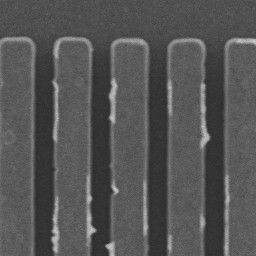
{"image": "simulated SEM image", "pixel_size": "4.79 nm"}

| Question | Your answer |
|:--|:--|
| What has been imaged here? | parallel lines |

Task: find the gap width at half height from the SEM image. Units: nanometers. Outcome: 97.1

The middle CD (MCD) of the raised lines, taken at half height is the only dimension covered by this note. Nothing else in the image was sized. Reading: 176 nanometres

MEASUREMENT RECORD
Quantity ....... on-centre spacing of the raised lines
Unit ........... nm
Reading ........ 273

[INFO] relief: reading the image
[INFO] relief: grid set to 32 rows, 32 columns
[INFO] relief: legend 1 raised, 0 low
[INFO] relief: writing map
00000000000000000000000000000000
00000000000000000000000000000000
00000000000000000000000000000000
00000000000000000000000000000000
00000000000000000000000000000000
11110001111000111100011110001111
11110001111100111100011111001111
11110001111000111100011111001111
11110001111000111100011110001111
11110001111000111100011110001111
11110001111000111100011111001111
11110001111000111100011111001111
11110001111000111100011111001111
11110001111000111100011111001111
11110001111000111100011111001111
11110001111000111100011111001111
11110001111000111100011111001111
11110001111000111100011111001111
11110001111000111100011111001111
11110001111000111100011111001111
11110001111000111100011111001111
11110001111000111100011111001111
11110001111000111100011110001111
11110001111000111100011111001111
11110001111000111100011111001111
11110001111000111100011111001111
11110001111000111100011111001111
11110001111000111100011111001111
11110001111100111100011111001111
11110001111000111100011110001111
11110001111001111100011110001111
11110001111000111100011111001111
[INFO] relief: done